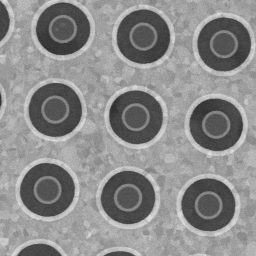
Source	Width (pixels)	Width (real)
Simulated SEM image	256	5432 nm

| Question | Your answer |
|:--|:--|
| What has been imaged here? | an array of small figures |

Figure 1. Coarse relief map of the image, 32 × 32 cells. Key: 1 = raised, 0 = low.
01111100001111111111111111111111
01111000000111110000111111111111
00110001100111100000011111000011
01110011100011000110011110000001
01110001100111000110001100011000
11111000000111000110011100011000
11111100001111100000011100011000
11111111111111110000111110000001
11111111111111111111111111000011
11111111111111111111111111111111
11111000011111111111111111111111
11110000001111100001111111111111
01100011001111000000111110000111
11100011000110001100011100000011
11100011001110001100011100110011
11110000001110001100011000110001
11110000011111000000111100110001
11111111111111100001111100000011
11111111111111111111111110000111
11111111111111111111111111111111
11110001111111111111111111111111
11100000011111000011111111111111
11100110011110000001111100001111
11000110001110011001111000000111
11000110001100011000111001100011
11100000011100011000110001100011
11110000111110000001110001100011
11111111111111000011111000000111
11111111111111111111111100001111
11111111111111111111111111111111
11100011111111111111111111111111
11000000111110000111111111111111